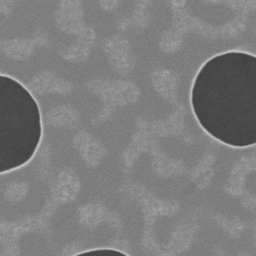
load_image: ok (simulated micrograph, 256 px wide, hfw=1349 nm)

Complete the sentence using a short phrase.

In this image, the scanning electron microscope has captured holes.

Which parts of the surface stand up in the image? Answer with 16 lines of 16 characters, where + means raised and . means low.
++++++++++++++++
++++++++++++++++
++++++++++++++++
++++++++++++++..
++++++++++++....
..++++++++++....
..++++++++++....
..++++++++++....
..+++++++++++...
..++++++++++++++
.+++++++++++++++
++++++++++++++++
++++++++++++++++
++++++++++++++++
++++++++++++++++
++++++++++++++++